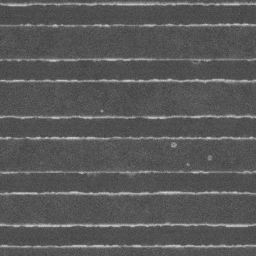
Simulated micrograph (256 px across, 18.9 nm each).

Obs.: lines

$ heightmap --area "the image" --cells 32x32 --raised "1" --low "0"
11110000000100000000000001000000
00000000000000000000000000000000
00000000000000000000000000000000
11111111111111111111111111111111
11111111111111111111111111111111
11111111111111111111111111111111
11111111111111111111111111111111
01100111000000000000000001100000
00000000000000000000000000000000
00000000000000000000000000000000
11111111111111111111111111111111
11111111111111111111111111111111
11111111111111111111111111111111
11111111111111111111111111111111
11111111111111111111111111111111
00000000000000000000000000000000
00000000000000000000000000000000
11111111111111111111111111111111
11111111111111111111111111111111
11111111111111111111111111111111
11111111111111111111111111111111
10000000001000000000000000000000
00000000000000000000000000000000
00000000000000000000000000000000
11111111111111111111111111111111
11111111111111111111111111111111
11111111111111111111111111111111
11111111111111111111111111111111
00000000000000000000000000000000
00000000000000000000000000000000
00000000000000000000000000000000
11111111111111111111111111111111